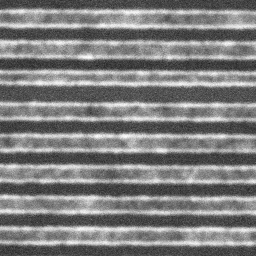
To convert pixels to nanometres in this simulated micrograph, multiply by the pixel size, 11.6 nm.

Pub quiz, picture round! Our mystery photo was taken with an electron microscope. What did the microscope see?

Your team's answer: parallel lines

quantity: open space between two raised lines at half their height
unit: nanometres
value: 189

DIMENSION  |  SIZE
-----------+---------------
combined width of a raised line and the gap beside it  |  361 nanometers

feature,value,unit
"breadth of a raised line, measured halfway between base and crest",177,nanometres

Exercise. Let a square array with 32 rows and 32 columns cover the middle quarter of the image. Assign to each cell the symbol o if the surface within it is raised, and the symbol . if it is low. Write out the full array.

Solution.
................................
................................
oooooooooooooooooooooooooooooooo
oooooooooooooooooooooooooooooooo
oooooooooooooooooooooooooooooooo
................................
................................
................................
................................
................................
oooooooooooooooooooooooooooooooo
oooooooooooooooooooooooooooooooo
oooooooooooooooooooooooooooooooo
oooooooooooooooooooooooooooooooo
................................
................................
................................
................................
oooooooooooooooooooooooooooooooo
oooooooooooooooooooooooooooooooo
oooooooooooooooooooooooooooooooo
.....ooooooooooooooooooooooooooo
................................
................................
................................
................................
oooooooooooooooooooooooooooooooo
oooooooooooooooooooooooooooooooo
oooooooooooooooooooooooooooooooo
............................oooo
................................
................................